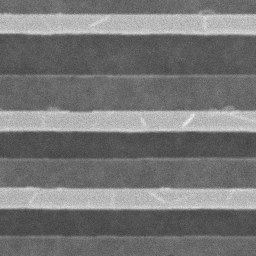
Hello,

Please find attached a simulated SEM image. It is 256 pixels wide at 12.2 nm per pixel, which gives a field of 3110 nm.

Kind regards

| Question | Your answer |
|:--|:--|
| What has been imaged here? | lines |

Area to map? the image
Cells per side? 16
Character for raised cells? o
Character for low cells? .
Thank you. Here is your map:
oooooooooooooooo
oooooooooooooooo
................
................
................
oooooooooooooooo
oooooooooooooooo
oooooooooooooooo
................
................
oooooooooooooooo
oooooooooooooooo
oooooooooooooooo
................
................
oooooooooooooooo